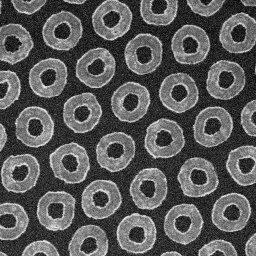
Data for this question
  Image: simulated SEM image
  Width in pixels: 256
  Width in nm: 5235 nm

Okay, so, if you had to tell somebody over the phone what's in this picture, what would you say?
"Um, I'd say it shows a regular array of ring-shaped raised bodies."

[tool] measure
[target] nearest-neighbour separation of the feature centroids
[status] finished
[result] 983 nm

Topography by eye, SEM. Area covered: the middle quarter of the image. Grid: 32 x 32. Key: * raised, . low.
...***....***...*******.........
*..***....***....*****..........
*..****..***.......*........**..
*...********..............******
.....******..............*******
......***......****.....****..**
.............********...***....*
.....**......***.****...***....*
..******....***....**...***....*
.*******....***....**....***.***
****..***...***....**.....******
***....**...***...***......****.
***....**....*******............
***...***.....*****.............
****.***...............****.....
.*******..............*******...
..*****..............********...
............***......**....***..
.........********...***....***..
.........********...***....***..
****....***....***...**...****..
*****...***....***...********...
*.****..***....***....******....
...***..****..***...............
...***...*******..............**
....**...******...............**
*..***.....***......****.....***
*****..............******....***
*****.............*******....**.
.***...*****.....**....**....***
......*******....**....***...***
.....*********...**....***....**